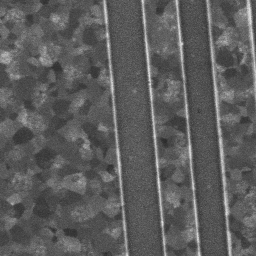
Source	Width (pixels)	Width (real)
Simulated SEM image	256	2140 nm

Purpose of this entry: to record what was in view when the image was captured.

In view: one or a few lines or trenches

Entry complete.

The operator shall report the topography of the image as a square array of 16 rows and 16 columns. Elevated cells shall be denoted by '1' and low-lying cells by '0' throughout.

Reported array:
1111111001100111
1111111001100111
1111111001100111
1111111001100111
1111111001100111
1111111001110111
1111111001110011
1111111000110011
1111111000110011
1111111000110011
1111111000110011
1111111100110011
1111111100110011
1111111100110011
1111111100110011
1111111100110011